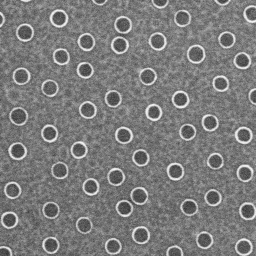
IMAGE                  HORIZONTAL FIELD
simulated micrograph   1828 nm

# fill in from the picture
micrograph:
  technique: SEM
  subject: a regular array of raised bodies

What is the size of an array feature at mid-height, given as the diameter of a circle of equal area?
114 nm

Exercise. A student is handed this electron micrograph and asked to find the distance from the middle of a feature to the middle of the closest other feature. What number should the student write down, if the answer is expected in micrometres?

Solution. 0.212